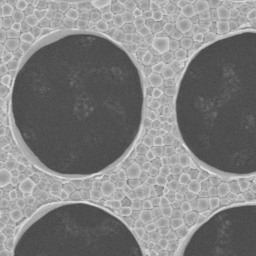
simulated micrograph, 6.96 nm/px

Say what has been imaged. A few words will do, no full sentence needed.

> holes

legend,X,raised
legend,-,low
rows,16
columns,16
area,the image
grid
XXXXXXXXXXXXXXXX
XXXXXXXXXXXXXXXX
XXX----XXXXXXX--
XX------XXXX----
X--------XXX----
X--------XX-----
X--------XX-----
X--------XX-----
X--------XX-----
XX------XXXX----
XXX----XXXXXX---
XXXXXXXXXXXXXXXX
XXXXXXXXXXXXXXXX
XXX----XXXXXX---
X-------XXXX----
X--------XXX----